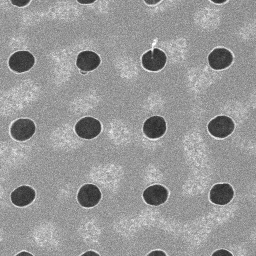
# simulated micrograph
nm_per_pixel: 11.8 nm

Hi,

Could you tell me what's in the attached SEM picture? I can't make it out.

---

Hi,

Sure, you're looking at a regular array of holes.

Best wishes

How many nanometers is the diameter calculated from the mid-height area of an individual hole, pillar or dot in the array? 277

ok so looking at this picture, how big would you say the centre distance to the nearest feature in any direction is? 776 nanometres